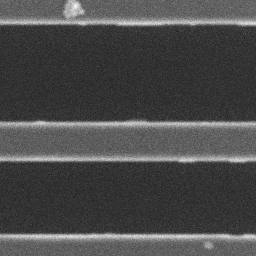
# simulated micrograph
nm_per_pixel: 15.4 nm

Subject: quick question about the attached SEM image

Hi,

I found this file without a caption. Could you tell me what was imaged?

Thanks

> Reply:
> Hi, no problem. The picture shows lines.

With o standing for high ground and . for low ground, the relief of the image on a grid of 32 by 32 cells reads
oooooooooooooooooooooooooooooooo
oooooooooooooooooooooooooooooooo
oooooooooooooooooooooooooooooooo
................................
................................
................................
................................
................................
................................
................................
................................
................................
................................
................................
................................
oooooooooooooooooooooooooooooooo
oooooooooooooooooooooooooooooooo
oooooooooooooooooooooooooooooooo
oooooooooooooooooooooooooooooooo
oooooooooooooooooooooooooooooooo
................................
................................
................................
................................
................................
................................
................................
................................
................................
oooooooooo.oooooooooooooooooo.oo
oooooooooooooooooooooooooooooooo
oooooooooooooooooooooooooooooooo